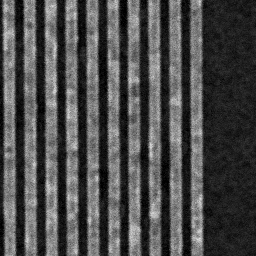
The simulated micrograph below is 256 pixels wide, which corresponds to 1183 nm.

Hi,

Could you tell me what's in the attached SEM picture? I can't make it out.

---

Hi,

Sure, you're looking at parallel lines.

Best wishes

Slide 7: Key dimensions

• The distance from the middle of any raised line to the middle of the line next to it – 95.7 nm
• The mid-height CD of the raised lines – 9.61 pixels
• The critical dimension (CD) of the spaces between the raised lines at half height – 49.1 nm